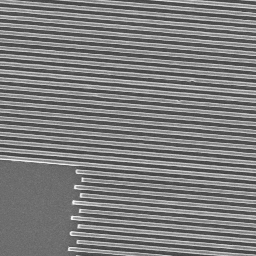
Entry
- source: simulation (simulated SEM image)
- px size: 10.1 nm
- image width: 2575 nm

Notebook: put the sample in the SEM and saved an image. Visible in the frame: parallel lines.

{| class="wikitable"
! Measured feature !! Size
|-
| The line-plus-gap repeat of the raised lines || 0.0782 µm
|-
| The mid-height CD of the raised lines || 35.1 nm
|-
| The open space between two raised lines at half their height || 43.8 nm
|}